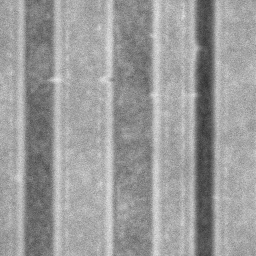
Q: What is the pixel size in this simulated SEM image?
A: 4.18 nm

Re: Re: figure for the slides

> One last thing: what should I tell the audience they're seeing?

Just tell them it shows one or a few lines or trenches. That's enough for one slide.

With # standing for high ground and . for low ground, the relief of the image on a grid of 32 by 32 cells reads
###....#######.....#####...#####
###....#######.....#####...#####
###....#######.....#####...#####
###....#######.....#####...#####
###....#######.....#####...#####
###....#######.....######..#####
###....#######.....######..#####
###....#######.....#####...#####
###....#######.....#####...#####
###....#######......####...#####
###....#######.....#####...#####
###....#######.....#####...#####
###....#######.....#####...#####
###....#######.....#####...#####
###....#######.....#####...#####
###....#######.....#####...#####
###....#######.....#####...#####
###....#######.....#####...#####
###....#######......####...#####
###....#######.....#####...#####
###....#######.....#####...#####
###....#######.....#####...#####
###....#######.....#####...#####
###....#######.....#####...#####
###....#######.....#####...#####
###....#######.....#####...#####
###....#######.....#####...#####
###....#######......####...#####
###....#######......####...#####
###....#######.....#####...#####
###....#######.....#####...#####
###....#######.....#####...#####